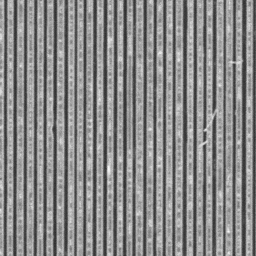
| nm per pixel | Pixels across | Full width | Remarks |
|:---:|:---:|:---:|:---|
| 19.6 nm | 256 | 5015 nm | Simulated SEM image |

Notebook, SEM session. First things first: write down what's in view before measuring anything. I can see parallel lines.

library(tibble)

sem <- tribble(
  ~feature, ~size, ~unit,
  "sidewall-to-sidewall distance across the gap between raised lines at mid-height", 85.7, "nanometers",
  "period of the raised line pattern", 195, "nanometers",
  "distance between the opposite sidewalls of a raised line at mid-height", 103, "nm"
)